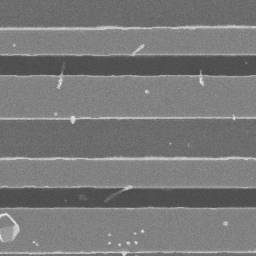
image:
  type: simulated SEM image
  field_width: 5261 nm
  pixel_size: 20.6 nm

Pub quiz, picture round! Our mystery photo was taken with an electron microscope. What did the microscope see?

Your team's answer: lines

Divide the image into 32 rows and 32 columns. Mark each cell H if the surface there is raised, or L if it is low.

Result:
LLLLLLLLLLLLLLLLLLLLLLLLLLLLLLLL
LLLLLLLLLLLLLLLLLLLLLLLLLLLLLLLL
LLLLLLLLLLLLLLLLLLLLLLLLLLLLLLLL
LLLLLLLLLLLLLLLLLLLLLLLLLLLLHHLL
HHHHHHHHHHHHHHHHHHHHHHHHHHHHHHHH
HHHHHHHHHHHHHHHHHHHHHHHHHHHHHHHH
HHHHHHHHHHHHHHHHHHHHHHHHHHHHHHHH
LLLLLLLLLLLLLLLLLLLLLLLLLLLLLLLL
LLLLLLLLLLLLLLLLLLLLLLLLLLLLLLLL
HHLHHHHHHHHHLLHHHLLLHHHHHHLHLLLH
HHHHHHHHHHHHHHHHHHHHHHHHHHHHHHHH
HHHHHHHHHHHHHHHHHHHHHHHHHHHHHHHH
HHHHHHHHHHHHHHHHHHHHHHHHHHHHHHHH
HHHHHHHHHHHHHHHHHHHHHHHHHHHHHHHH
HHHHHHHHHHHHHHHHHHHHHHHHHHHHHHHH
LLLLLLLLLLLLLLLLLLLLLLLLLLLLLLLL
LLLLLLLLLLLLLLLLLLLLLLLLLLLLLLLL
LLLLLLLLLLLLLLLLLLLLLLLLLLLLLLLL
LLLLLLLLLLLLLLLLLLLLLLLLLLLLLLLL
LLLLLLLLLLLLLLLLLLLLLLLLLLLLLLLL
HHHHHHHHHHHHHHHHHHHHHHHHHHHHHHHH
HHHHHHHHHHHHHHHHHHHHHHHHHHHHHHHH
HHHHHHHHHHHHHHHHHHHHHHHHHHHHHHHH
LLLLLLLLLLLLLLLHLLLLLLLLLLLLLLLL
LLLLLLLLLLLLLLLLLLLLLLLLLLLLLLLL
LLLLLLLLLLLLLLLLLLLLLLLLLLLLLLLL
HHHHHHHHHHHHHHHHHHHHHHHHHHHHHHHH
HHHHHHHHHHHHHHHHHHHHHHHHHHHHHHHH
HHHHHHHHHHHHHHHHHHHHHHHHHHHHHHHH
HHHHHHHHHHHHHHHHHHHHHHHHHHHHHHHH
HHHHHHHHHHHHHHHHHHHHHHHHHHHHHHHH
HHHHHHHHHHHHHHHHHHLLLLLLLLLLLLLL